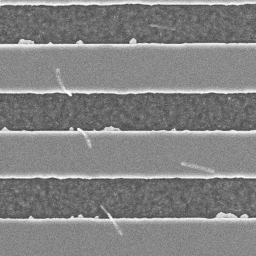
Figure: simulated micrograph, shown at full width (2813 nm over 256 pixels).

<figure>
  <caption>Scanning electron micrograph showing lines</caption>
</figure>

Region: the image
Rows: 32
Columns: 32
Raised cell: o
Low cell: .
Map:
ooooooooo.oooo....o.......o.oo..
................................
................................
................................
................................
.................ooo...ooooooooo
oooooooooooooooooooooooooooooooo
oooooooooooooooooooooooooooooooo
oooooooooooooooooooooooooooooooo
oooooooooooooooooooooooooooooooo
oooooooooooooooooooooooooooooooo
ooooooooooooooooooooooooooooooo.
................................
................................
................................
................................
oooooooooooooooooooooooooooooooo
oooooooooooooooooooooooooooooooo
oooooooooooooooooooooooooooooooo
oooooooooooooooooooooooooooooooo
oooooooooooooooooooooooooooooooo
oooooooooooooooooooooooooooooooo
................................
................................
................................
................................
................................
oooooooooooooooooooooooooooooooo
oooooooooooooooooooooooooooooooo
oooooooooooooooooooooooooooooooo
oooooooooooooooooooooooooooooooo
oooooooooooooooooooooooooooooooo